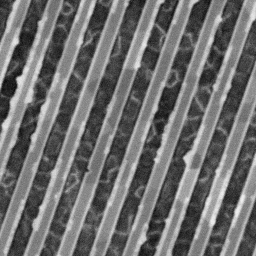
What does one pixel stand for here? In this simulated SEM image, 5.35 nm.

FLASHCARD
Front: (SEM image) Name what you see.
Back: parallel lines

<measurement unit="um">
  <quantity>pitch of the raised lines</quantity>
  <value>0.165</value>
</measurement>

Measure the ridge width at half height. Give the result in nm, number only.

66.9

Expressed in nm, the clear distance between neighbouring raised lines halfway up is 95.3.